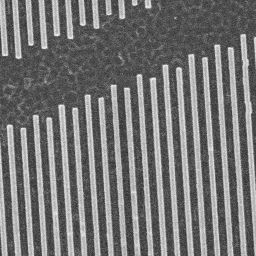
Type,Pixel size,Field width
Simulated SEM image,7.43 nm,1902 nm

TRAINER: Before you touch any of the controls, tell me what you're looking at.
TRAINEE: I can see parallel lines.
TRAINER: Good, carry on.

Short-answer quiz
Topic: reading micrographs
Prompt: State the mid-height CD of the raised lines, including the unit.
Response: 36.1 nm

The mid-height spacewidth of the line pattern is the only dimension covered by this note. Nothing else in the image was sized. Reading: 58.4 nanometers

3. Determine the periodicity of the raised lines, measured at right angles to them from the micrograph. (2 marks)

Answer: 13.3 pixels